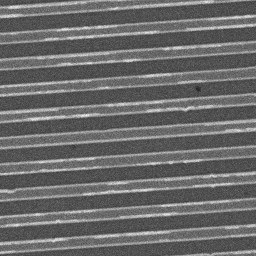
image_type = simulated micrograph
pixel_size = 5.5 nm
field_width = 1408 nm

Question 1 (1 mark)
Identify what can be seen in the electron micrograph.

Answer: parallel lines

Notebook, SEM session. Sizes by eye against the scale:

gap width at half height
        81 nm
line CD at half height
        11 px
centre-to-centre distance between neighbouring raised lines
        0.144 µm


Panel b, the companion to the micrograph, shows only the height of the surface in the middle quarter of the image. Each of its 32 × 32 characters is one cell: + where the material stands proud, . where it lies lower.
................................
................................
........................+++.++++
..............++++++++++++++++++
++++++++++++++++++++++++++++++++
++++++++++++++++++..............
++++............................
................................
................................
....................++++++++++++
......++++++++++++++++++++++++++
++++++++++++++++++++++++++++..+.
++++++++++++++..................
................................
................................
..........................++++++
............++++++++++++++++++++
++++++++++++++++++++++++++++++++
++++++++++++++++++++............
++++++..........................
................................
................................
.....................+++++++++++
.......+++++++++++++++++++++++++
+++++++++++++++++++++++++++++.++
+++++++++++++++.................
+...............................
................................
...........................+++++
.............+++++++++++++++++++
++++++++++++++++++++++++++++++++
+++++++++++++++++++++...........